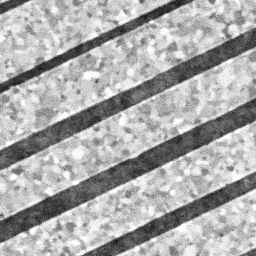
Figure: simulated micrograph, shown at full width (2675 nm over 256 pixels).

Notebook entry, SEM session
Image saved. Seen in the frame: one or a few lines or trenches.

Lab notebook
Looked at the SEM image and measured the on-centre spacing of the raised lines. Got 692 nm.